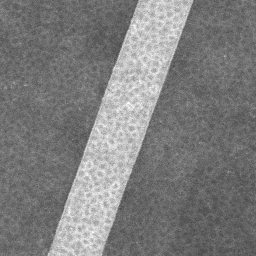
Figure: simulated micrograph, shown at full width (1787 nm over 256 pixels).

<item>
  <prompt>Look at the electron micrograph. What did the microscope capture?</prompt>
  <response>one or a few lines or trenches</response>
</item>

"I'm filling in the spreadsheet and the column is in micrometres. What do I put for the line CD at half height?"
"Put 0.351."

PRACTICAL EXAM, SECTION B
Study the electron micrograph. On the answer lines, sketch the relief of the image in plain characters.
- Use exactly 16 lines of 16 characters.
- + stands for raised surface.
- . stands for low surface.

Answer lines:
.........+++....
........++++....
........+++.....
.......++++.....
.......+++......
.......+++......
......++++......
......+++.......
......+++.......
.....++++.......
.....+++........
.....+++........
....++++........
....+++.........
....+++.........
...+++..........